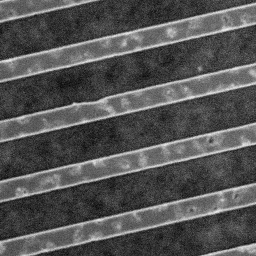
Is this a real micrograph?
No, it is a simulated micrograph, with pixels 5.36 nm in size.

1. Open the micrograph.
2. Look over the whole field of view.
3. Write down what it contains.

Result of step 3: parallel lines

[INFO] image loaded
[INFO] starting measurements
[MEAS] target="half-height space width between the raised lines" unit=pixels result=37.8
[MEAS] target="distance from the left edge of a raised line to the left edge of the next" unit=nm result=314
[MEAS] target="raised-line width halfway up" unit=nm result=110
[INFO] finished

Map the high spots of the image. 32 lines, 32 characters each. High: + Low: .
++++++++++.....................+
++++++.....................+++++
+......................+++++.+++
..................++++++++++.+..
..............+++++++++++.......
..........+++++++++++...........
.....++++++++++++...............
..++++++++++....................
++++++++.....................+++
+++......................+++++++
.....................+++++++++++
................+++++++++++.....
.............++++++++++.........
.......++++++++++++.............
...+++++++++++..................
++++++++++......................
++++++.....................+++++
+......................+++.+++++
...................+++++++++++..
..............+++++++++++.......
..........+++++++++++...........
.....+++++++++++................
.+++++++++++....................
++++++++......................++
+++......................++++.++
.....................+++++++++++
................+++++++++++.....
............+++++++++++.........
.......++++++++++++.............
...+++++++++++..................
++++++++++......................
+++++......................+++++